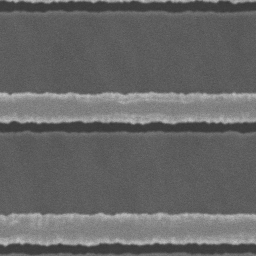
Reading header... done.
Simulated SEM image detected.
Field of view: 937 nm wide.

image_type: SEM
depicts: lines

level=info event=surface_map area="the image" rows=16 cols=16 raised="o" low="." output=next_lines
................
oooooooooooooooo
oooooooooooooooo
oooooooooooooooo
oooooooooooooooo
oooooooooooooooo
oooooooooooooooo
oooooooooooooooo
oooooooooooooooo
oooooooooooooooo
oooooooooooooooo
oooooooooooooooo
oooooooooooooooo
oooooooooooooooo
oooooooooooooooo
................